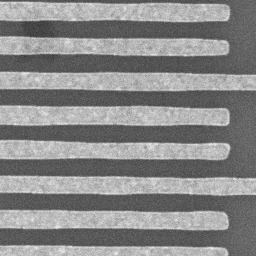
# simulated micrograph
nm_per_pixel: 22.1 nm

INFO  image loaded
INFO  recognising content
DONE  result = wiring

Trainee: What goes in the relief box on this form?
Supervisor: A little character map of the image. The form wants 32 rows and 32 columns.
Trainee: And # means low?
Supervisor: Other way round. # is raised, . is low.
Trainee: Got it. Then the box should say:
##############...######.........
#############################...
#####..#####....############....
................................
................................
############################....
############################....
................................
................................
################################
################################
................................
................................
######################..........
#############################...
.######........########..###....
................................
................................
#############################...
############################....
................................
................................
################################
################################
................................
................................
##################......####....
############################....
..######........############....
................................
................................
############################....